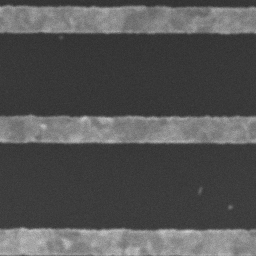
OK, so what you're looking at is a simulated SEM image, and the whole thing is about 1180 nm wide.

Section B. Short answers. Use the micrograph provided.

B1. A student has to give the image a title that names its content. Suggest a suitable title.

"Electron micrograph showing lines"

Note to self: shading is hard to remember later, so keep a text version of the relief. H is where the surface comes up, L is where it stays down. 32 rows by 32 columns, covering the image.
LLLLLLLLLLLLLLLLLLLLLLLLLLLLLLLL
HHHHHHHHHHHHLHHHHHHHHHHHHHHHHHHH
HHHHHHHHHHHHHHHHHHHHHHHHHHHHHHHH
HHHHHHHHHHHHHHHHHHHHHHHHHHHHHHHH
LLLLLLLLLLLLLLLLLLLLLLLLLLLLLLLL
LLLLLLLLLLLLLLLLLLLLLLLLLLLLLLLL
LLLLLLLLLLLLLLLLLLLLLLLLLLLLLLLL
LLLLLLLLLLLLLLLLLLLLLLLLLLLLLLLL
LLLLLLLLLLLLLLLLLLLLLLLLLLLLLLLL
LLLLLLLLLLLLLLLLLLLLLLLLLLLLLLLL
LLLLLLLLLLLLLLLLLLLLLLLLLLLLLLLL
LLLLLLLLLLLLLLLLLLLLLLLLLLLLLLLL
LLLLLLLLLLLLLLLLLLLLLLLLLLLLLLLL
LLLLLLLLLLLLLLLLLLLLLLLLLLLLLLLL
LLLHLLLLLLLLLLLLLLLLLLLLLLLLLLLL
HHHHHHHHHHHHHHHHHHHHHHHHHHHHHHHH
HHHHHHHHHHHHHHHHHHHHHHHHHHHHHHHH
HHHHHHHHHLHHHHHHHHHHHHHHHHHHHHHH
LLLLLLLLLLLLLLLLLLLLLLLLLLLLLLLL
LLLLLLLLLLLLLLLLLLLLLLLLLLLLLLLL
LLLLLLLLLLLLLLLLLLLLLLLLLLLLLLLL
LLLLLLLLLLLLLLLLLLLLLLLLLLLLLLLL
LLLLLLLLLLLLLLLLLLLLLLLLLLLLLLLL
LLLLLLLLLLLLLLLLLLLLLLLLLLLLLLLL
LLLLLLLLLLLLLLLLLLLLLLLLLLLLLLLL
LLLLLLLLLLLLLLLLLLLLLLLLLLLLLLLL
LLLLLLLLLLLLLLLLLLLLLLLLLLLLLLLL
LLLLLLLLLLLLLLLLLLLLLLLLLLLLLLLL
LLLLLLLLLLLLLLLLLLLLLLLLLLLLLLLL
HHHHHHHHHHHHHHHHHHHHHHHHHHHHHHHH
HHHHHHHHHHHHHHHHHHHHHHHHHHHHHHHH
HHHHHHHHHHHHHHHHHHHHHHHHHHHHHHHH